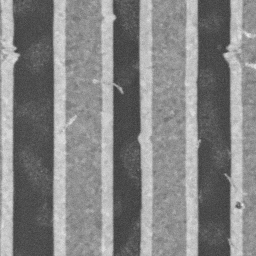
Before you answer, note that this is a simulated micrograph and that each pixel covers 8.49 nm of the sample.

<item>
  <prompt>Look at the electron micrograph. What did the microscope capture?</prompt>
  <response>one or a few lines or trenches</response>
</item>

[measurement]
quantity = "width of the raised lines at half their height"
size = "388 nm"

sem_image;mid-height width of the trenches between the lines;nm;388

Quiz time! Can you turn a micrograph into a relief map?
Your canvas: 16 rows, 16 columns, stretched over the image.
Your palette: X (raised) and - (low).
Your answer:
----XXX--XXX---X
----XXX--XXX---X
----XXX--XXX---X
X---XXX--XXX---X
----XXX--XXX---X
----XXX--XXX---X
----XXX--XXX---X
----XXX--XXX---X
----XXX--XXX---X
----XXX--XXX---X
----XXX--XXX---X
----XXX--XXX---X
----XXX--XXX---X
----XXX--XXX---X
----XXX--XXX---X
----XXX--XXX---X